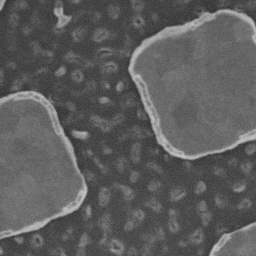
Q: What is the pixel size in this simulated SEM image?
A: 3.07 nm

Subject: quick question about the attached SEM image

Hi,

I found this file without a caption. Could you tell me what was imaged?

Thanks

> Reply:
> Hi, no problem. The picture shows raised bodies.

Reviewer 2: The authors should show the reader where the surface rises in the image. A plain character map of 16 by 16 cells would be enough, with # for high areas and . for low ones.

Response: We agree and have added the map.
................
............####
.........#######
........########
........########
.........#######
###......#######
####.....#######
####......######
####.......###..
#####...........
#####...........
#####...........
####............
#..............#
.............###